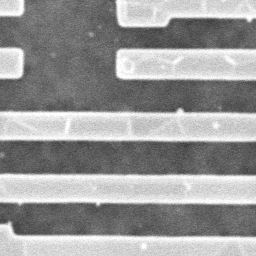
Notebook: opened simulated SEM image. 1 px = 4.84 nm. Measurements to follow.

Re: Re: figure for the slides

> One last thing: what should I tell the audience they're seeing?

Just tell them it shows wiring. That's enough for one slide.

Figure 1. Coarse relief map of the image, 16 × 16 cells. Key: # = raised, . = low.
#......#########
........##......
................
#......#########
#......#########
................
................
################
################
................
................
################
################
................
#...............
################